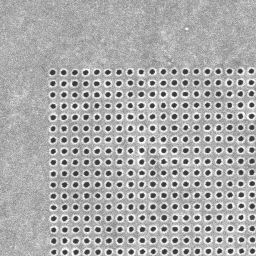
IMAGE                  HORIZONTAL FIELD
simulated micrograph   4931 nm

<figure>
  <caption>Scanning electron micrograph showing a regular array of holes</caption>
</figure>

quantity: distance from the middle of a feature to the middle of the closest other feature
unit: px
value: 10.9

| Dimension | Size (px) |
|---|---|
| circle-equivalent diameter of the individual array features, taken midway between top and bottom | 5.53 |